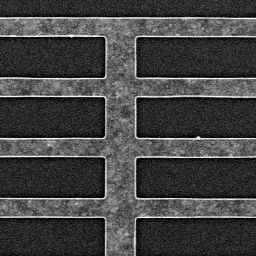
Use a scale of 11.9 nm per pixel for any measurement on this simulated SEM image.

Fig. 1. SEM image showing groups of lines, slits or small figures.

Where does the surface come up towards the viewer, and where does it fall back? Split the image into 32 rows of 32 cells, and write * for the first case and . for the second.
................................
................................
********************************
********************************
........*....*****..********.***
.............****...............
.............****...............
.............****...............
.............****...............
.............****...............
********************************
********************************
.............****...............
.............****...............
.............****...............
.............****...............
.............****...............
********************************
********************************
**......************************
.............****...............
.............****...............
.............****...............
.............****...............
.............****...............
********************************
********************************
.............****...............
.............****...............
.............****...............
.............****...............
.............****...............